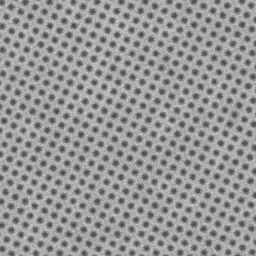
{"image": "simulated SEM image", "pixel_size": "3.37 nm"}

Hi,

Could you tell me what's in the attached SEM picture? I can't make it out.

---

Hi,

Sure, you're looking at a regular array of holes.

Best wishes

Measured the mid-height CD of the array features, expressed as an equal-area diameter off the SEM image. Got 7.39 pixels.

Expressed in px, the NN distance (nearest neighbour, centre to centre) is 10.4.